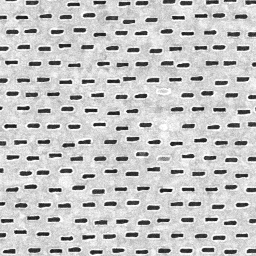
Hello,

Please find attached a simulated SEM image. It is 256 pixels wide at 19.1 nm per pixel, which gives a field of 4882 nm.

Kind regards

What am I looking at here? a regular array of holes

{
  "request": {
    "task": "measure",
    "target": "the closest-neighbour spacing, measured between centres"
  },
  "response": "325 nanometers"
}